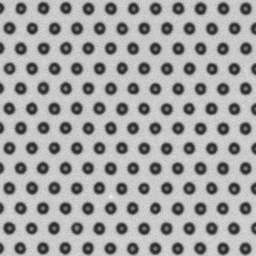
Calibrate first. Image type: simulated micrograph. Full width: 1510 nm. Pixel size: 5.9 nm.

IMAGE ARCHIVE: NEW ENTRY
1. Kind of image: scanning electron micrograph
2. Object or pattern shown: a regular array of ring-shaped grooves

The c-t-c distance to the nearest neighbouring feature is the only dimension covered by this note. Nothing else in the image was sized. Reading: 131 nm